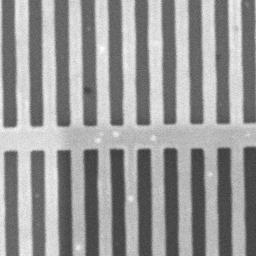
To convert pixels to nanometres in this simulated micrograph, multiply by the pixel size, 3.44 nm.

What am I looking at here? groups of lines, slits or small figures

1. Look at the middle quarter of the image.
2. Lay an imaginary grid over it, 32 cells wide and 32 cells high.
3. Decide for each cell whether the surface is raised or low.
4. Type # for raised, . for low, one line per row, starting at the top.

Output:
..##....###....###...###....###.
..##....###....###....##....###.
..##....###....###....###...###.
..##....###....###....###...###.
..##....###....###....###...###.
..##....###....###....###...###.
..##....###....###....###...###.
..##....###....###....###...###.
..##....###....###....###...###.
..##....###....###....###...###.
..##....###....###....###...###.
..##....###....###....###...###.
..##....###....###....###...###.
..##....###....###....###...###.
..###...###....###....###...###.
..###...####..#####..###########
################################
################################
################################
################################
################################
.####...####...###....###...####
..###....##....###....###...####
..###....##....###....###...####
..###....##....###....###...####
..###....###...###....###...####
..###....###...###....###....###
..###....###...###....###....###
..###....###...###....###....###
..###....###...###....###....###
..###....###...###....###....###
..###....###...###....###....###